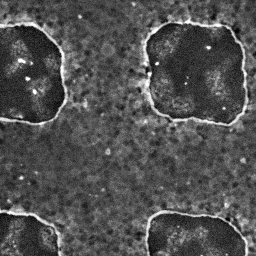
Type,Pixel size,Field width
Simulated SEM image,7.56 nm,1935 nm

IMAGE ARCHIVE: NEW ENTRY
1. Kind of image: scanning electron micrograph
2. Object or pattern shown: holes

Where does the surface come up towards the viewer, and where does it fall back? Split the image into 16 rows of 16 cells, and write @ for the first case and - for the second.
@@@@@@@@@@@@@@@@
@@@@@@@@@@--@@@@
---@@@@@@------@
----@@@@@------@
----@@@@@------@
----@@@@@------@
----@@@@@------@
---@@@@@@@@@@--@
@@@@@@@@@@@@@@@@
@@@@@@@@@@@@@@@@
@@@@@@@@@@@@@@@@
@@@@@@@@@@@@@@@@
@@@@@@@@@@@@@@@@
--@@@@@@@@---@@@
---@@@@@@------@
----@@@@@------@